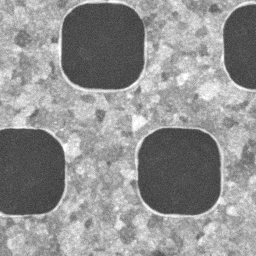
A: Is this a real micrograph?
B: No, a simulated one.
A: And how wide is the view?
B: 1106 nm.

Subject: holes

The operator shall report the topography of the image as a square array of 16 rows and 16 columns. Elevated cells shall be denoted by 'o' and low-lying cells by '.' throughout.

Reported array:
ooooo...ooooooo.
oooo.....ooooo..
oooo.....ooooo..
oooo.....ooooo..
oooo.....ooooo..
ooooo...ooooooo.
oooooooooooooooo
oooooooooooooooo
...oooooo....ooo
....ooooo.....oo
....ooooo.....oo
....ooooo.....oo
....ooooo.....oo
oooooooooooooooo
oooooooooooooooo
oooooooooooooooo